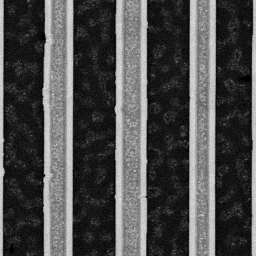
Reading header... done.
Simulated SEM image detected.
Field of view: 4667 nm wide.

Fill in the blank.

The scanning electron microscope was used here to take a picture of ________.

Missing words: one or a few lines or trenches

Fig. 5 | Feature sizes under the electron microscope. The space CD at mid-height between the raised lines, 49.4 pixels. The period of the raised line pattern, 1310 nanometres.